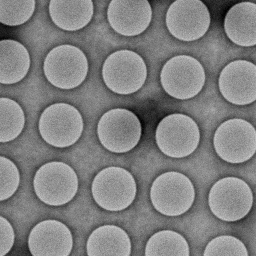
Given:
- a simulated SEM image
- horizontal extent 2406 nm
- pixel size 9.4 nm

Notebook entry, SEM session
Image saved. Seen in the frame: an array of small figures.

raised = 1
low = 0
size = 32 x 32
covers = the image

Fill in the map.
11110011111100111110001110000011
11110011111100111110011111000111
11100001111000111110011111001111
00000000110000111100011111001111
00000000000000000000001110000111
11100000000000000000000000000011
11100011110000011000000000000000
11110011111001111100011100000000
11110011111001111100111110001111
11100011111001111100111111001111
00000001110001111100111110011111
00000000000000011000011110001111
10000000000000000000000000000111
11100011100000000000000000000000
11100111110001111000011000000000
11100111110011111000111100001110
11100111110011111100111110011111
10000011110001111000111110011111
00000000000001110000111100011111
00000000000000000000011000001110
11000011000000000000000000000000
11000111100001110000000000000000
11001111110011111001111100001100
11001111110011111001111100011110
10000111100011111001111100111110
00000011000011110001111100111110
00000000000000000000111000011110
10000000000000000000000000001100
10001111000011100000000000000000
11001111100111110001111000000000
11001111100111110011111000111100
10001111100111110011111100111110